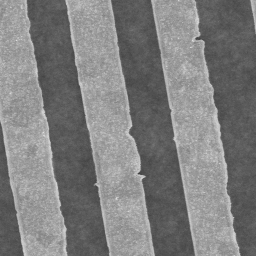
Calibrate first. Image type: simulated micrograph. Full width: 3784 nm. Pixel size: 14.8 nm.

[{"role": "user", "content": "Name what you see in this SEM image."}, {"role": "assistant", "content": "one or a few lines or trenches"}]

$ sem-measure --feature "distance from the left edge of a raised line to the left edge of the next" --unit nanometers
1250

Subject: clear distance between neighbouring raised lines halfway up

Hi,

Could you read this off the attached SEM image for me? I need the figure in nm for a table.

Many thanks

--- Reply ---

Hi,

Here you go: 612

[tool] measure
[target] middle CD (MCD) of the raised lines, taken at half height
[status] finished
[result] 639 nanometers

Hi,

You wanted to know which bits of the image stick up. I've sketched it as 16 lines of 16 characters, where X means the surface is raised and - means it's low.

XX--XXX---XX----
XX--XXX---XX----
XX---XX---XX----
XX---XX---XXX---
XX---XXX--XXX---
XX---XXX--XXX---
XXX--XXX---XX---
XXX--XXX---XXX--
XXX---XX---XXX--
XXX---XXX--XXX--
-XX---XXX--XXX--
-XX---XXX--XXX--
-XXX--XXX---XX--
-XXX--XXX---XX--
-XXX---XX---XXX-
-XXX---XXX--XXX-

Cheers